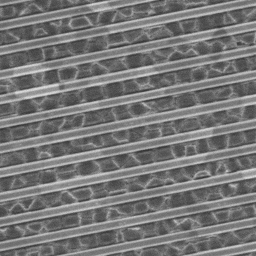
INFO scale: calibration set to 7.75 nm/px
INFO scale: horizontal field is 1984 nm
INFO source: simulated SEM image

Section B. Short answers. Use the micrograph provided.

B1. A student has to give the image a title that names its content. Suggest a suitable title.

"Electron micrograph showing parallel lines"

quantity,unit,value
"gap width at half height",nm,128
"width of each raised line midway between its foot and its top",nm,60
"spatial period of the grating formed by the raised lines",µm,0.187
